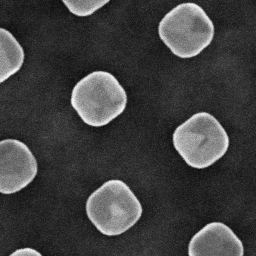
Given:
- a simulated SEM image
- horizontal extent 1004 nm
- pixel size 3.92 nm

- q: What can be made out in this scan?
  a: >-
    raised bodies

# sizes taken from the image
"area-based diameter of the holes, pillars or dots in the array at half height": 204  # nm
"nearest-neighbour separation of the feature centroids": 433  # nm